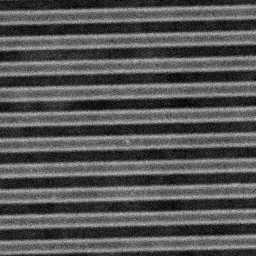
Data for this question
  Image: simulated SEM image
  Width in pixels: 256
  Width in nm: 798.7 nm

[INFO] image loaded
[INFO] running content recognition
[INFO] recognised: parallel lines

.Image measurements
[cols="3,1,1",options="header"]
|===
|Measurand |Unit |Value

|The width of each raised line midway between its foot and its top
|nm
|39.8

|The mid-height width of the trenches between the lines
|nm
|39.8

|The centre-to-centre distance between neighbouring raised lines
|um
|0.0796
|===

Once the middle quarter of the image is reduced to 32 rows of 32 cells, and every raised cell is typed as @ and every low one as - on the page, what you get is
@@@@@@@@@@@@@@@@@@@@@@@@@@@@@@@@
@@@@@@@@@@@@@@@@@@@@@@@@@@@@@@@@
--------------------------------
--------------------------------
--------------------------------
------------@@@@@@@@@@@@@@@@@@@@
@@@@@@@@@@@@@@@@@@@@@@@@@@@@@@@@
@@@@@@@@@@@@@@@@@@@@@@@@@@@@@@@@
@@@@@@@@@-@@@@@@@@@-------------
--------------------------------
--------------------------------
--------------------------@@@@@@
@@@@@@@@@@@@@@@@@@@@@@@@@@@@@@@@
@@@@@@@@@@@@@@@@@@@@@@@@@@@@@@@@
@@@@@@@@@@@@@@@@@@@@@@@@--------
--------------------------------
--------------------------------
--------------------------------
@@@@@@@@@@@@@@@@@@@@@@@@@@@@@@@@
@@@@@@@@@@@@@@@@@@@@@@@@@@@@@@@@
@@@@@@@@@@@@@@@@@@@@@@@@@@@@@@@@
--------------------------------
--------------------------------
--------------------------------
--------------@@@@-@@@@@@@@@@@@@
@@@@@@@@@@@@@@@@@@@@@@@@@@@@@@@@
@@@@@@@@@@@@@@@@@@@@@@@@@@@@@@@@
@@@@@@@@@@@@--------------------
--------------------------------
--------------------------------
-----------------------------@@@
@@@@@@@@@@@@@@@@@@@@@@@@@@@@@@@@